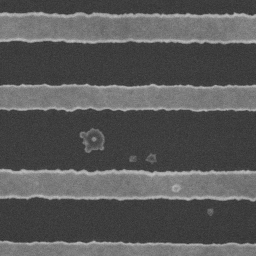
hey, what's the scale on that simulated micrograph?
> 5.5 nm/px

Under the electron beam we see lines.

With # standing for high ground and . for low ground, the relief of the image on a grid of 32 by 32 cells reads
................................
................................
################################
################################
################################
................................
................................
................................
................................
................................
................................
################################
################################
################################
................................
................................
................................
................................
................................
................................
................................
###########.######.....#########
################################
################################
################################
................................
................................
................................
................................
................................
######################......##..
################################